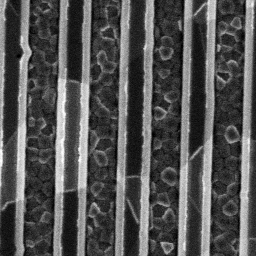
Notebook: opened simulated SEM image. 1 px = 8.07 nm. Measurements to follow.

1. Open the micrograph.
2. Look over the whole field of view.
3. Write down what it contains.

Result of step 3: one or a few lines or trenches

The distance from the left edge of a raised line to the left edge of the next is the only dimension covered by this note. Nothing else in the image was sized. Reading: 502 nm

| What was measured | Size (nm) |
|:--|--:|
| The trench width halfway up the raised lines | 299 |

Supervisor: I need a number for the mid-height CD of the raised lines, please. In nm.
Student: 198